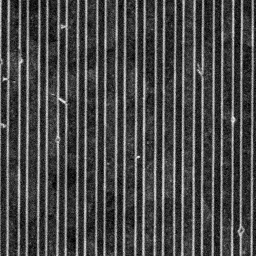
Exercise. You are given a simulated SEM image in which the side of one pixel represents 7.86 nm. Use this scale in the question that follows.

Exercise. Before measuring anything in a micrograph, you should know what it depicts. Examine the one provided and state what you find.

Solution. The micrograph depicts parallel lines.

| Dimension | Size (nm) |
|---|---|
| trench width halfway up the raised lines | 64.8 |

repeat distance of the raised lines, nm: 152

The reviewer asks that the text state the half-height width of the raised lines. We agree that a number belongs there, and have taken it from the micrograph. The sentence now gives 87.4 nm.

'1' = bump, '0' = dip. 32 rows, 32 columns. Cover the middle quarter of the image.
01100011001110011100111001110011
01100011001110011100111001110011
01100011001110011100111001110011
01100011001110011100111001110011
01100011001110011100111001110011
01100011001110011100111001110011
01100011001110011100111001110011
01100011001110011100111001110011
01100111001110011100111001110011
11100111001110011100111001110011
01100111001110011100111001110011
01100111001110011100111001100011
01100111001110011100111001100011
01100111001110011100111001100011
01100111001110011100111001100011
01100111001110011100111001100011
01100111001110011100111001100011
01100111001110011100111001100011
01100111001110011100111001100011
01100111001110011100111001100011
01100111001110011100111001100011
01100111001110011100111001100011
01100111001110011100111001100011
01100111001110011100111001100011
01100111001110011100111001100011
01100111001110011100111001100011
01100111001110011100111001100011
01100111001110011100111001100011
01100111001110011100111001100011
01100111001110011100111001100011
01100111001110011100111001100011
01100111001110011100111001100011